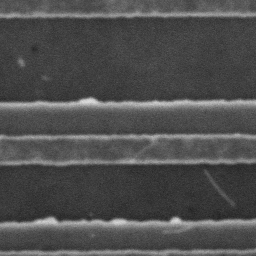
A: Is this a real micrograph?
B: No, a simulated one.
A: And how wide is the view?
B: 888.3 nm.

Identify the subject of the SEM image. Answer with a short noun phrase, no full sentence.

lines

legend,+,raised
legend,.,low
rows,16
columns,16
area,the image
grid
++++++++++++++++
................
................
................
................
................
++++++++++++++++
++++++++++++++++
++++++++++++++++
++++++++++++++++
................
................
................
................
++++++++++++++++
++++++++++++++++